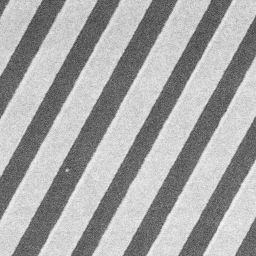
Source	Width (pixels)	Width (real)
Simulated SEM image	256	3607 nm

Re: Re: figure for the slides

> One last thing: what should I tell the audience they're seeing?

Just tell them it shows lines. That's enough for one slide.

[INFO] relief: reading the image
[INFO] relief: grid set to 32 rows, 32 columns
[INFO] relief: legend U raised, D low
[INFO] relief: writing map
DUUUUDDDUUUUDDDUUUUDDDUUUUDDDUUU
DUUUDDDDUUUDDDDUUUDDDDUUUUDDUUUU
UUUUDDDUUUUDDDUUUUDDDUUUUDDDUUUU
UUUDDDDUUUDDDUUUUDDDDUUUDDDUUUUD
UUUDDDUUUUDDDUUUDDDDUUUUDDDUUUUD
UUDDDDUUUDDDUUUUDDDUUUUDDDUUUUDD
UUDDDUUUUDDDUUUDDDDUUUUDDDUUUDDD
UDDDUUUUDDDUUUUDDDUUUUDDDUUUUDDD
UDDDUUUUDDDUUUDDDDUUUUDDUUUUDDDD
DDDUUUUDDDUUUUDDDUUUUDDDUUUUDDDU
DDDUUUDDDDUUUDDDDUUUUDDUUUUDDDUU
DDUUUUDDDUUUUDDDUUUUDDDUUUUDDDUU
DDUUUDDDDUUUDDDDUUUUDDDUUUDDDUUU
DUUUUDDDUUUUDDDUUUUDDDUUUDDDDUUU
UUUUDDDUUUUDDDDUUUDDDUUUUDDDUUUU
UUUUDDDUUUDDDDUUUUDDDUUUDDDUUUUD
UUUDDDUUUUDDDUUUUDDDUUUUDDDUUUUD
UUDDDDUUUDDDDUUUUDDDUUUDDDUUUUDD
UUDDDUUUUDDDUUUUDDDUUUUDDDUUUUDD
UDDDDUUUDDDDUUUUDDDUUUDDDUUUUDDD
UDDDUUUUDDDUUUUDDDUUUUDDDUUUUDDD
DDDUUUUDDDDUUUUDDDUUUDDDUUUUDDDU
DDDUUUUDDDUUUUDDDUUUUDDDUUUDDDDU
DDUUUUDDDDUUUDDDDUUUDDDUUUUDDDUU
DDUUUUDDDUUUUDDDUUUDDDDUUUDDDDUU
DUUUUDDDDUUUDDDUUUUDDDUUUUDDDUUU
DUUUDDDDUUUUDDDUUUDDDUUUUDDDUUUU
UUUUDDDUUUUDDDUUUUDDDUUUUDDDUUUU
UUUDDDDUUUUDDDUUUDDDUUUUDDDUUUUD
UUUDDDUUUUDDDUUUUDDDUUUDDDDUUUUD
UUDDDDUUUUDDDUUUDDDUUUUDDDUUUUDD
UUDDDUUUUDDDUUUDDDDUUUUDDDUUUUDD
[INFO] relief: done